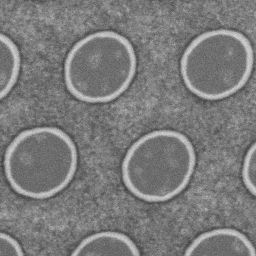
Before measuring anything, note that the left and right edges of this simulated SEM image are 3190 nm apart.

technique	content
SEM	raised bodies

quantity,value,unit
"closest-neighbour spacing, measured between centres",1410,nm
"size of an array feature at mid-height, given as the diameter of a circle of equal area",837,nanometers